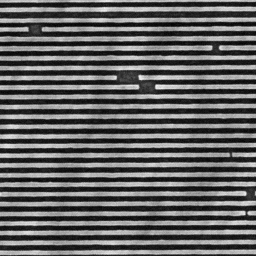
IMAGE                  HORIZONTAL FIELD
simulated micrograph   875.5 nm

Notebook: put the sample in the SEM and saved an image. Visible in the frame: parallel lines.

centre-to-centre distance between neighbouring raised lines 0.0333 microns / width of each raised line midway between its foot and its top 13.7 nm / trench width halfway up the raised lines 20.1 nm